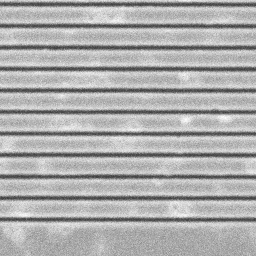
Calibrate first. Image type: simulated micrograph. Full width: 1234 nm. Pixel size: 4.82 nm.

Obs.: parallel lines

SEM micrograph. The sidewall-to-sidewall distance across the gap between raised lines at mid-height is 24.7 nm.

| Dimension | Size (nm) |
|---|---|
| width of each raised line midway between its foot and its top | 79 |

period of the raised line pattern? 0.104 µm